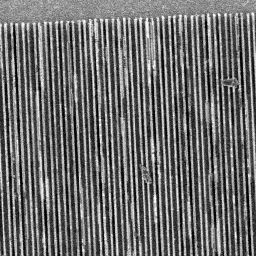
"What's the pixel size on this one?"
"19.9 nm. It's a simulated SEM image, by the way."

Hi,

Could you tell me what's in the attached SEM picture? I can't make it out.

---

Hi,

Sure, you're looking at parallel lines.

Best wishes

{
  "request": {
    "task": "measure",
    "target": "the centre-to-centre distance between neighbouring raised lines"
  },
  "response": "112 nanometres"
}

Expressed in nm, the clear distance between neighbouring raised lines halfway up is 79.5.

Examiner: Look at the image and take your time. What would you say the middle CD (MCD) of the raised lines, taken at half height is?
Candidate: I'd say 37.3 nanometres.